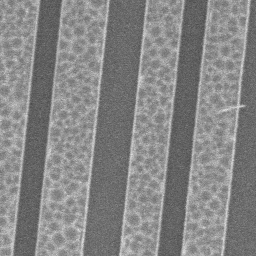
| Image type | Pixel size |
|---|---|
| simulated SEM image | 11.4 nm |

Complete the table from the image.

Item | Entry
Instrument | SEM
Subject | one or a few lines or trenches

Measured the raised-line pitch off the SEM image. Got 815 nm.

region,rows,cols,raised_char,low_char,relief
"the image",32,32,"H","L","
HHHHHLLLHHHHHHLLLLHHHHHLLLHHHHHL
HHHHHLLLHHHHHLLLLLHHHHHLLLHHHHHL
HHHHHLLLHHHHHLLLLLHHHHHLLLHHHHHL
HHHHHLLLHHHHHLLLLLHHHHHLLLHHHHHL
HHHHLLLHHHHHHLLLLLHHHHLLLLHHHHHL
HHHHLLLHHHHHHLLLLLHHHHLLLLHHHHHL
HHHHLLLHHHHHHLLLLLHHHHLLLHHHHHHL
HHHHLLLHHHHHHLLLLLHHHHLLLHHHHHLL
HHHHLLLHHHHHHLLLLHHHHHLLLHHHHHLL
HHHHLLLHHHHHHLLLLHHHHHLLLHHHHHLL
HHHHLLLHHHHHLLLLLHHHHHLLLHHHHHLL
HHHHLLLHHHHHLLLLLHHHHHLLLHHHHHLL
HHHHLLLHHHHHLLLLLHHHHHLLLHHHHHLL
HHHLLLHHHHHHLLLLLHHHHHLLLHHHHHLL
HHHLLLHHHHHHLLLLLHHHHLLLLHHHHHLL
HHHLLLHHHHHHLLLLLHHHHLLLHHHHHHLL
HHHLLLHHHHHHLLLLLHHHHLLLHHHHHLLL
HHHLLLHHHHHHLLLLLHHHHLLLHHHHHLLL
HHHLLLHHHHHHLLLLHHHHHLLLHHHHHLLL
HHHLLLHHHHHHLLLLHHHHHLLLHHHHHLLL
HHHLLLHHHHHLLLLLHHHHHLLLHHHHHLLL
HHHLLLHHHHHLLLLLHHHHHLLLHHHHHLLL
HHHLLHHHHHHLLLLLHHHHHLLLHHHHHLLL
HHLLLHHHHHHLLLLLHHHHHLLLHHHHHLLL
HHLLLHHHHHHLLLLLHHHHLLLHHHHHHLLL
HHLLLHHHHHHLLLLLHHHHLLLHHHHHLLLL
HHLLLHHHHHHLLLLLHHHHLLLHHHHHLLLL
HHLLLHHHHHHLLLLHHHHHLLLHHHHHLLLL
HHLLLHHHHHHLLLLHHHHHLLLHHHHHLLLL
HHLLLHHHHHLLLLLHHHHHLLLHHHHHLLLL
HHLLLHHHHHLLLLLHHHHHLLLHHHHHLLLL
HHLLLHHHHHLLLLLHHHHHLLLHHHHHLLLL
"